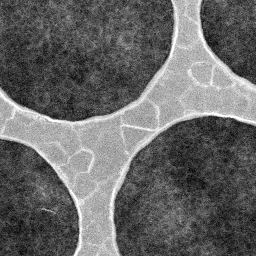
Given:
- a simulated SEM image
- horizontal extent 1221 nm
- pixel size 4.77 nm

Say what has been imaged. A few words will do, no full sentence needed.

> holes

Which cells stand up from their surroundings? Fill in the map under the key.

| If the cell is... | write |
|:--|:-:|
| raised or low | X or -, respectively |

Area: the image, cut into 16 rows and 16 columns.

-----------X----
-----------XX---
-----------XX---
-----------XX---
----------XXXX--
---------XXXXXXX
X-------XXXXXXXX
XXXX-XXXXXX----X
XXXXXXXXXX------
--XXXXXXX-------
---XXXXX--------
----XXXX--------
-----XX---------
-----XX---------
-----XX---------
-----XX---------